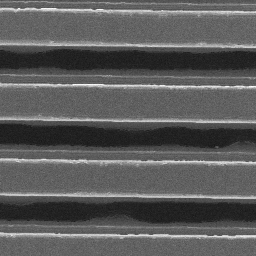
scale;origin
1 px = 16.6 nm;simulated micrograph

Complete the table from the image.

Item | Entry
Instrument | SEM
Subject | lines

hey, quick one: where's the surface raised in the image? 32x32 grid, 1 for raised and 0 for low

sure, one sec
11111111111111111111111111111111
11111111111111111111111111111111
11111111111111111111111111111111
11111111111111111111111111111111
11111111111111111111111111111111
11111111111111111111111111111111
00000000000000000000000000000000
00000000000000000000000000000000
00000000000000000000000000000000
11111111111111111111000000000000
11111111111111111111111111111111
11111111111111111111111111111111
11111111111111111111111111111111
11111111111111111111111111111111
11111111111111111111111111111111
00000000000000000000000000000000
00000000000000000000000000000000
00000000000000000000000000000000
00000000000000000000000000000000
11111111111111111111111111111111
11111111111111111111111111111111
11111111111111111111111111111111
11111111111111111111111111111111
11111111111111111111111111111111
00111111111111111111111111111111
00000000000000000000000000000000
00000000000000000000000000000000
00000000000000000000000000000000
11111111111111111111111111111100
11111111111111111111111111111111
11111111111111111111111111111111
11111111111111111111111111111111